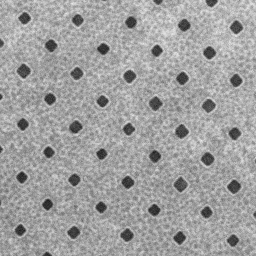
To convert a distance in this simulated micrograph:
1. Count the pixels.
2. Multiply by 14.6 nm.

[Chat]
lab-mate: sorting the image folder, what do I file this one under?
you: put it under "a regular array of holes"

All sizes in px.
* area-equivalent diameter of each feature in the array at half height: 13.2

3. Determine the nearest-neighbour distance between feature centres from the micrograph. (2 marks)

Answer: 538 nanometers